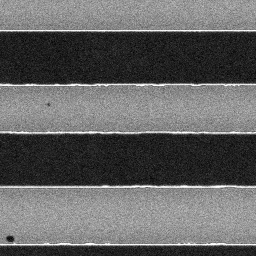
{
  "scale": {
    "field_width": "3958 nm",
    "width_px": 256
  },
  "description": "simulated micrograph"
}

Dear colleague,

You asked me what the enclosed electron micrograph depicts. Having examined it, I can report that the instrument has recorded lines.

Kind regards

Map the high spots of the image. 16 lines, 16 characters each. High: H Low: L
LLLLLLLLLLLLLLLL
LLLLLLLLLLLLLLLL
HHHHHHHHHHHHHHHH
HHHHHHHHHHHHHHHH
HHHHHHHHHHHHHHHH
LLLLLLLLLLLLLLLL
LLLLLLLLLLLLLLLL
LLLLLLLLLLLLLLLL
HHHHHHHHHHHHHHHH
HHHHHHHHHHHHHHHH
HHHHHHHHHHHHHHHH
HHHHHHHHHHHHHHHH
LLLLLLLLLLLLLLLL
LLLLLLLLLLLLLLLL
LLLLLLLLLLLLLLLL
HHHHHHHHHHHHHHHH